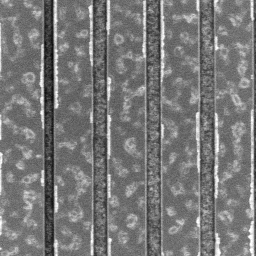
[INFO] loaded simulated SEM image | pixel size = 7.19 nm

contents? parallel lines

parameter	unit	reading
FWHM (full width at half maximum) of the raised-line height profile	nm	278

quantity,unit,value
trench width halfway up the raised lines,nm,105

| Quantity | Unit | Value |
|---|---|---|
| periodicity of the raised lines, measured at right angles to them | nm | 385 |